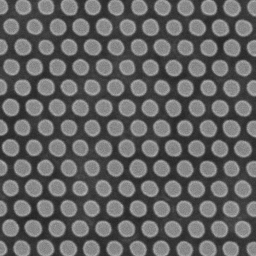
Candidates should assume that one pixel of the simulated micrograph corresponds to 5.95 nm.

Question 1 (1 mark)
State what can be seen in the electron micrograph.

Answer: a regular array of raised bodies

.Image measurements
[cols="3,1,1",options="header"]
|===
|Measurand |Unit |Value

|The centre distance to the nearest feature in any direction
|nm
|136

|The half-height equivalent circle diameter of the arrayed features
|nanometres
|96.9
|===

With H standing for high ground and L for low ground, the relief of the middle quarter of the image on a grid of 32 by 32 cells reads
LLHHHHLLHHHHLLHHHLLLHHHHLLHHHLLH
LLHHHHLLHHHHLLHHHHLLHHHHLLHHHLLH
LLLHHLLLLHHLLLLHHLLLLHHLLLHHHLLL
LLLLLLLLLLLLLLLLLLLLLLLLLLLLLLLL
HHLLLHHHLLLHHHLLLHHHLLLHHLLLLHHH
HHHLLHHHHLLHHHHLLHHHHLLHHHLLLHHH
HHHLLHHHHLLHHHHLLHHHHLLHHHLLLHHH
HHLLLLHHLLLLHHLLLHHHLLLLHHLLLHHH
LLLLLLLLLLLLLLLLLLLLLLLLLLLLLLLL
LLLHHLLLLHHLLLHHHLLLHHHLLLHHLLLL
LLHHHHLLHHHHLLHHHHLLHHHLLLHHHLLH
LLHHHHLLHHHHLLHHHHLLHHHLLLHHHLLH
LLLHHHLLLHHLLLLHHLLLHHHLLLHHHLLL
LLLLLLLLLLLLLLLLLLLLLLLLLLLLLLLL
HHLLLLHHLLLHHHLLLHHHLLLHHHLLLHHL
HHHLLHHHHLLHHHHLLHHHHLHHHHLLLHHH
HHHLLHHHHLLHHHHLLHHHHLLHHHLLLHHH
HHHLLLHHHLLLHHLLLHHHLLLHHHLLLHHH
LLLLLLLLLLLLLLLLLLLLLLLLLLLLLLLL
LLLHHLLLLHHLLLHHHLLLHHLLLLHHLLLL
LLHHHHLLHHHHLLHHHHLLHHHLLLHHHLLH
LLHHHHLLHHHHLLHHHHLLHHHLLLHHHLLH
LLLHHLLLLHHHLLHHHLLLHHHLLLHHHLLL
LLLLLLLLLLLLLLLLLLLLLLLLLLLLLLLL
HHLLLLHHLLLLHHLLLHHHLLLHHLLLLHHL
HHHLLHHHHLLHHHHLLHHHLLLHHHLLHHHH
HHHLLHHHHLLHHHHLLHHHHLLHHHLLHHHH
HHHLLLHHLLLLHHLLLHHHLLLHHHLLLHHH
LLLLLLLLLLLLLLLLLLLLLLLLLLLLLLLL
LLLHLLLLLHHLLLLHHLLLHHLLLLHHLLLL
LLHHHHLLHHHHLLHHHLLHHHHLLHHHHLLH
LLHHHHLLHHHHLLHHHHLLHHHLLHHHHLLH